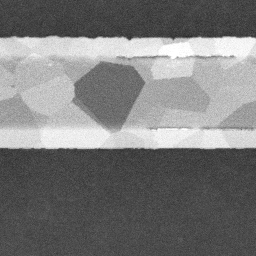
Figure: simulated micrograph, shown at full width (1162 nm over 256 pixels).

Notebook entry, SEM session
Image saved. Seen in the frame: one or a few lines or trenches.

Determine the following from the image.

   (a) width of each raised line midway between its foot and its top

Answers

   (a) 89.2 pixels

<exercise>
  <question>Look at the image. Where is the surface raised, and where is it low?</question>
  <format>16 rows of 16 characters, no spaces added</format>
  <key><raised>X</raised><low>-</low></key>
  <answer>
----------------
----------------
----------------
XXXXXXXXXXXXXXXX
XXXXXXXXXXXXXXXX
XXXXXXXXXXXXXXXX
XXXXXXXXXXXXXXXX
XXXXXXXXXXXXXXXX
XXXXXXXXXXXXXXXX
----------------
----------------
----------------
----------------
----------------
----------------
----------------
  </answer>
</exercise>